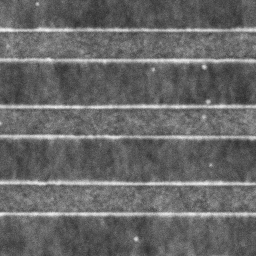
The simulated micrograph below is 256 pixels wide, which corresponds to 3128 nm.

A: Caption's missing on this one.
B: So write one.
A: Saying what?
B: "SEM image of lines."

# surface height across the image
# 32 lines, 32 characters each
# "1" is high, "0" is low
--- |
11111111111111111111111111111111
11111111111111111111111111111111
11111111111111111111111111111111
11111111111111111111111111111111
00000000000000000000000000000000
00000000000000000000000000000000
00000000000000000000000000000000
11111111111111111111000000000000
11111111111111111111111111111111
11111111111111111111111111111111
11111111111111111111111111111111
11111111111111111111111111111111
11111111111111111111111111111111
00000000000000000000000000000000
00000000000000000000000000000000
00000000000000000000000000000000
00000000000000000000000000000000
11111111111111111111111111111111
11111111111111111111111111111111
11111111111111111111111111111111
11111111111111111111111111111111
11111111111111111111111111111111
11111111111111111111111111111111
00000000000000000000000000000000
00000000000000000000000000000000
00000000000000000000000000000000
00000000000000000000000000000000
11111111111111111111111111111111
11111111111111111111111111111111
11111111111111111111111111111111
11111111111111111111111111111111
11111111111111111111111111111111